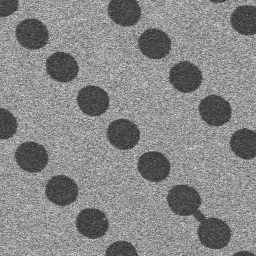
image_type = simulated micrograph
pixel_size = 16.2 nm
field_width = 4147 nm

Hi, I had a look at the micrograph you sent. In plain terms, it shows a regular array of holes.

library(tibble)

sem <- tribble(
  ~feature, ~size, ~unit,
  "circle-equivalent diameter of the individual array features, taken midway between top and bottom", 32.1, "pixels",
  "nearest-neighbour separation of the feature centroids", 724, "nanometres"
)